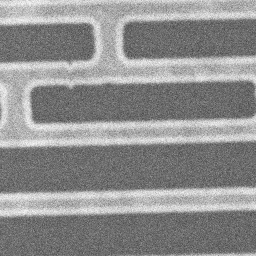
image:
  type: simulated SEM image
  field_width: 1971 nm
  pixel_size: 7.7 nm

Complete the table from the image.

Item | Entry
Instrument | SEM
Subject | one or a few lines or trenches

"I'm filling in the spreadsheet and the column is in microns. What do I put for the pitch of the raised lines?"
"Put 0.501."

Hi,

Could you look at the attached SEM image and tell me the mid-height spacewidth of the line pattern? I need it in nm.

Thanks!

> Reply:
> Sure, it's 350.